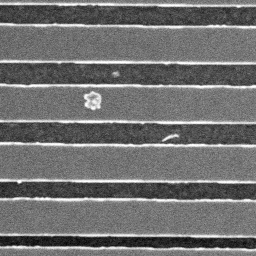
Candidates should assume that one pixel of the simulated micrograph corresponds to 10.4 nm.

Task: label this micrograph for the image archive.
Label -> lines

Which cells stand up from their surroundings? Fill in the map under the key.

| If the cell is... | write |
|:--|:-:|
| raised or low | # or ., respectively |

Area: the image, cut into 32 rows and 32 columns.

################################
................................
................................
################################
################################
################################
################################
################################
................................
................................
................................
################################
################################
################################
################################
................................
................................
................................
################################
################################
################################
################################
################################
................................
................................
################################
################################
################################
################################
........................########
................................
################################